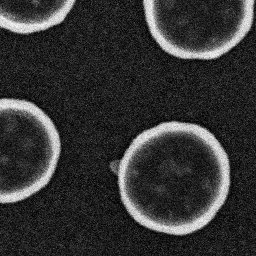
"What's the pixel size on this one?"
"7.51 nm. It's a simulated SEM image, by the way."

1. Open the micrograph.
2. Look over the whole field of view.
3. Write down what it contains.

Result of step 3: raised bodies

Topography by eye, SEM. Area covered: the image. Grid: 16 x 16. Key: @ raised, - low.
@@@@-----@@@@@@@
@@@------@@@@@@@
----------@@@@@-
------------@---
----------------
----------------
@@--------------
@@@-------------
@@@------@@@@---
@@@@----@@@@@@--
@@@-----@@@@@@--
@@------@@@@@@--
--------@@@@@@--
---------@@@@---
----------------
----------------